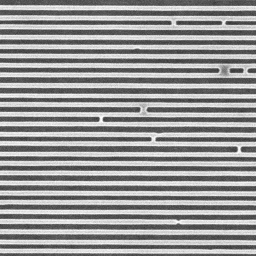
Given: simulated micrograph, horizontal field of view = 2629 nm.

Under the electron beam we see parallel lines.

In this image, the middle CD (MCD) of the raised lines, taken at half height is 3.62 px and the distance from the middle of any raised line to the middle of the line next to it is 99.9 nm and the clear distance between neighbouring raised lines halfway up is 62.9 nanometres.